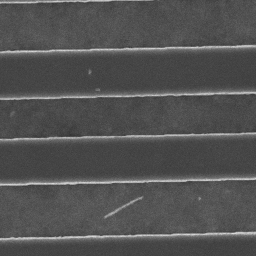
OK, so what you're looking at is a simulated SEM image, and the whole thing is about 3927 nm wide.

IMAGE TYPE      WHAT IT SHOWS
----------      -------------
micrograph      lines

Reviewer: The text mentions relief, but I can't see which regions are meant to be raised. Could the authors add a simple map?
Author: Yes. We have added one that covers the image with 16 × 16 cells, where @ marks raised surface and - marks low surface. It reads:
----------------
----------------
----------------
@@@@@@@@@@@@@@@@
@@@@@@@@@@@@@@@@
@@@@@@@@@@@@@@@@
----------------
----------------
--------@@@@@@@@
@@@@@@@@@@@@@@@@
@@@@@@@@@@@@@@@@
@@@@@-----------
----------------
----------------
----------------
@@@@@@@@@@@@@@@@